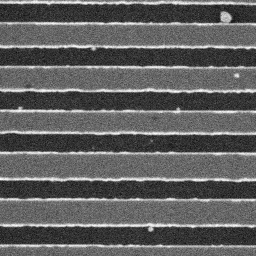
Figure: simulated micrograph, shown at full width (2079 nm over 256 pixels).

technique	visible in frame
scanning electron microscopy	lines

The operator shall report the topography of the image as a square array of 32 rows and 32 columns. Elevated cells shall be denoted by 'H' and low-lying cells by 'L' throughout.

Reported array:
LLLLLLLLLLLLLLLLLLLLLLLLLLLLLLHH
LLLLLLLLLLLLLLLLLLLLLLLLLLLLLLLL
LLLLLLLLLLLLLLLLLLLLLLLLLLLLLLLL
HHHHHHHHHHHHHHHHHHHHHHHHHHHHHHHH
HHHHHHHHHHHHHHHHHHHHHHHHHHHHHHHH
HHHHHHHHHHHHHHHHHHHHHHHHHHHHHHHH
LLLLLLLLLLLLLLLLLLLLLLLLLLLLLLLL
LLLLLLLLLLLLLLLLLLLLLLLLLLLLLLLL
HHHHHHHHHHHHHHHHHHHHHHHHHHHHHHHH
HHHHHHHHHHHHHHHHHHHHHHHHHHHHHHHH
HHHHHHHHHHHHHHHHHHHHHHHHHHHHHHHH
LLLLLLLLLLLLLLLLLLLLLHHHLLHLHHHH
LLLLLLLLLLLLLLLLLLLLLLLLLLLLLLLL
LLLLLLLLLLLLLLLLLLLLLLLLLLLLLLLL
HHHHHHHHHHHHHHHHHHHHHHHHHHHHHHHH
HHHHHHHHHHHHHHHHHHHHHHHHHHHHHHHH
HHHHHHHHHHHHHHHHHHHHHHHHHHHHHHHH
LLLLLLLLLLLLLLLLLLLLLLLLLLLLLLLL
LLLLLLLLLLLLLLLLLLLLLLLLLLLLLLLL
HHHHHHHHHHHHHHHHHHHHHHHHHHHHHHHH
HHHHHHHHHHHHHHHHHHHHHHHHHHHHHHHH
HHHHHHHHHHHHHHHHHHHHHHHHHHHHHHHH
LLLLLLHHHLLHLHHLLHLLHHHLHHLHHHHH
LLLLLLLLLLLLLLLLLLLLLLLLLLLLLLLL
LLLLLLLLLLLLLLLLLLLLLLLLLLLLLLLL
HHHHHHHHHHHHHHHHHHHHHHHHHHHHHHHH
HHHHHHHHHHHHHHHHHHHHHHHHHHHHHHHH
HHHHHHHHHHHHHHHHHHHHHHHHHHHHHHHH
LLLLLLLLLLLLLLLLLLLLLLLLLLLLLLLL
LLLLLLLLLLLLLLLLLLLLLLLLLLLLLLLL
LLLLLLLLLLLLLLLLLLLLLLLLLLLLLLLL
HHHHHHHHHHHHHHHHHHHHHHHHHHHHHHHH